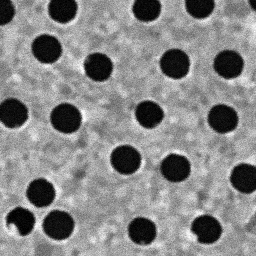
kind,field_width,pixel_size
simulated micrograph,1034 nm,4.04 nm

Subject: a regular array of holes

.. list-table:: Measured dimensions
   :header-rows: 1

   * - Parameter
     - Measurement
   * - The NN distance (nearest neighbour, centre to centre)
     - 216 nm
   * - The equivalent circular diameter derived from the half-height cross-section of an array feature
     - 123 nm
